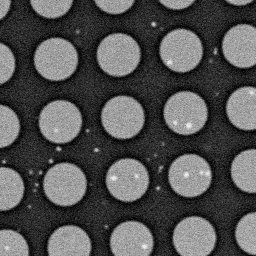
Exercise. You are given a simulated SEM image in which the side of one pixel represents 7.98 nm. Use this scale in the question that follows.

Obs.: an array of small figures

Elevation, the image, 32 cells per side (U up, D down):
UDDDUUUUUDDDUUUUDDDDUUUUDDDDDUUD
UDDDDUUUDDDDDUUDDDDDDDDDDDDDDDDD
DDDDDDDDDDDDDDDDDDDDDDDDDDDDDDDD
DDDDDDDDDDDDDDDDDDDDDDDDDDDDDUUU
DDDDDDDDDDDDDDUUDDDDDUUUUDDDUUUU
DDDDDUUUUDDDDUUUUDDDUUUUUDDDUUUU
UDDDUUUUUDDDUUUUUDDDUUUUUDDDUUUU
UUDDUUUUUUDDUUUUUDDDUUUUUDDDUUUU
UUDDDUUUUDDDDUUUUDDDDUUUDDDDDDDD
UDDDDUUUUDDDDDDDDDDDDDDDDDDDDDDD
DDDDDDDDDDDDDDDDDDDDDDDDDDDDDDDD
DDDDDDDDDDDDDDDDDDDDDDDDDDDDDUUU
DDDDDDDDDDDDDDUUUDDDDUUUUDDDDUUU
UDDDDDUUUUDDDUUUUUDDDUUUUUDDUUUU
UUDDDUUUUUDDDUUUUUDDDUUUUUDDDUUU
UUDDDUUUUUDDDUUUUUDDDUUUUUDDDUUU
UUDDDUUUUUDDDUUUUDDDDDUUDDDDDDDD
UUDDDDUUUDDDDDDDDDDDDDDDDDDDDDDD
DDDDDDDDDDDDDDDDDDDDDDDDDDDDDDDD
DDDDDDDDDDDDDDDDDDDDDDDUUDDDDDUU
DDDDDDDUUDDDDDUUUUDDDDUUUUDDDUUU
UUDDDDUUUUDDDDUUUUDDDUUUUUDDDUUU
UUUDDDUUUUUDDUUUUUUDDUUUUUDDDUUU
UUUDDUUUUUUDDUUUUUDDDDUUUUDDDDUU
UUUDDDUUUUDDDDUUUUDDDDDUDDDDDDDD
UUDDDDDUUDDDDDDDDDDDDDDDDDDDDDDD
DDDDDDDDDDDDDDDDDDDDDDDDDDDDDDDD
DDDDDDDDDDDDDDDDDDDDDDDUUUDDDDUU
DDDDDDDDUUDDDDDUUUDDDDUUUUUDDDUU
UUUDDDUUUUUDDDUUUUUDDDUUUUUDDUUU
UUUDDDUUUUUDDDUUUUUDDDUUUUUDDDUU
UUUDDDUUUUUDDDUUUUUDDDUUUUDDDDDU